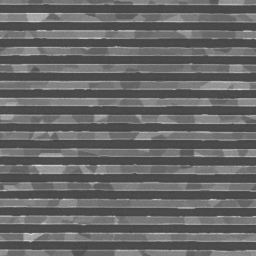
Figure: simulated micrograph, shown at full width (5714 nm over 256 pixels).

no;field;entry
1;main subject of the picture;parallel lines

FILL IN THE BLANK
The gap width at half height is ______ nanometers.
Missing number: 218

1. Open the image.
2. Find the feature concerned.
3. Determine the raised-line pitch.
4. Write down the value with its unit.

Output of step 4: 377 nanometers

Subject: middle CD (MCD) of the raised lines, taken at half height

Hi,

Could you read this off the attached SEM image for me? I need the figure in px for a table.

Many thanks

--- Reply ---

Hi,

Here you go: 7.12